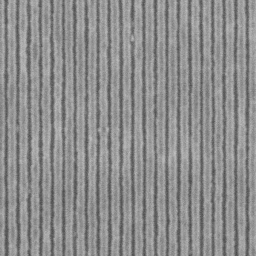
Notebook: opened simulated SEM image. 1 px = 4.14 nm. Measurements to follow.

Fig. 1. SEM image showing parallel lines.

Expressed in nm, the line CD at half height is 33.2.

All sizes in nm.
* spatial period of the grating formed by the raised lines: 47.6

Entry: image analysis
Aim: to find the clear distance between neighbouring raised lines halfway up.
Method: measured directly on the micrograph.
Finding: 3.74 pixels